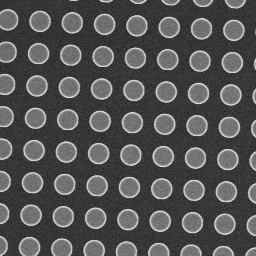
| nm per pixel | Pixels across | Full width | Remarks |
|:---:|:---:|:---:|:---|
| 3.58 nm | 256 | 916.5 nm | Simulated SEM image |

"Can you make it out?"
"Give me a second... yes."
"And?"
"an array of small figures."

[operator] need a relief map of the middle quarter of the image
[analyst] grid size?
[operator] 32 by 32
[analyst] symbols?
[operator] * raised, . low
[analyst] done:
.........**.....****....****....
................................
................................
**..............................
****...****.....***......*......
****...*****...*****...*****....
****...*****...*****...*****...*
***....*****...*****...*****...*
........***.....***....*****...*
.........................*......
................................
**..............................
***....****.....***.............
***....****....****....****.....
***...******...*****...*****...*
***....****....*****...*****...*
........**.....****....****....*
........................**......
................................
*...............................
***....***.....***..............
***...*****...*****....****....*
***...*****...*****...*****...**
***...*****...*****...*****...**
*......***.....****....****....*
........................**.....*
................................
................................
**.....***.....**...............
***...*****...*****....***.....*
***...*****...*****...*****...**
**....*****...*****...*****...**